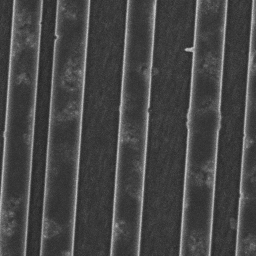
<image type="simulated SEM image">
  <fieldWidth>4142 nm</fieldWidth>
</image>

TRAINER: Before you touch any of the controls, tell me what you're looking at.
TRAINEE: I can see parallel lines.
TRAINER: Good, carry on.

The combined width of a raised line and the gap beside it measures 1020 nm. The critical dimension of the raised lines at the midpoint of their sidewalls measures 474 nm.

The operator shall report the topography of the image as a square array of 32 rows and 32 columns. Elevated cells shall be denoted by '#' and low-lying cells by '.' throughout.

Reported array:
..###..####.....###......###....
..###..####.....###......###....
..###..####.....###......###....
..###..####.....###.....####...#
..###..####.....###.....####...#
.####..####.....###.....####...#
.####..####.....###.....####...#
.####..####.....###.....####...#
.####..####....####.....####...#
.####..####....####.....####...#
.####..###.....####.....####...#
.###..####.....####.....####...#
.###..####.....####.....###....#
.###..####.....####.....###....#
.###..####.....###......####...#
.###..####.....###.....####....#
.###..####.....###......###....#
.###..####.....###......###....#
.###..####.....###.....####...##
.###..####.....###.....####...##
####..####.....###.....####...##
####..####.....###.....####...##
####..####....####.....####...##
####..####....####.....####...##
####..####....####.....####...##
###...###.....####.....####...##
###..####.....####.....####...##
###..####.....####.....###....##
###..####.....####.....###....##
###..####.....###......###....##
###..####.....###......###....##
###..####.....###......###....##